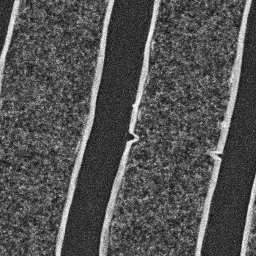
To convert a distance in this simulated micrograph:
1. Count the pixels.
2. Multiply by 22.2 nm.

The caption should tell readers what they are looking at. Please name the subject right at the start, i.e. one or a few lines or trenches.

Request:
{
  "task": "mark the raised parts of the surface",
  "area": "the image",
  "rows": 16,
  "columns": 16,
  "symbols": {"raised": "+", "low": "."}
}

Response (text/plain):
.++++++...+++++.
.++++++...+++++.
.+++++...++++++.
++++++...++++++.
++++++...++++++.
++++++...++++++.
++++++...+++++..
++++++..++++++..
+++++...++++++..
+++++...++++++..
+++++...+++++...
+++++..++++++...
++++...++++++...
++++...++++++...
++++...++++++..+
++++..++++++...+